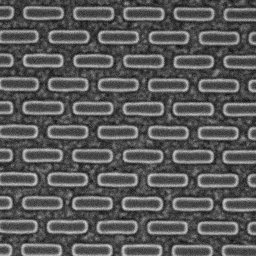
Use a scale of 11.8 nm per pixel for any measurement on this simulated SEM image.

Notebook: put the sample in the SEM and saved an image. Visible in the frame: groups of lines, slits or small figures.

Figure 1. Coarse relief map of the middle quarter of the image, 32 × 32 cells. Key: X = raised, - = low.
---XXXXXXXXX----XXXXXXXXX---XXXX
--------------------------------
--------------------------------
--------------------------------
XXXXXX---XXXXXXXXX---XXXXXXXXXX-
XXXXXX---XXXXXXXXX---XXXXXXXXXX-
XXX-X----XXXXXXXXX----XXXXXXXXX-
--------------------------------
--------------------------------
--------------------------------
--XXXXXXXXXX---XXXXXXXXXX--XXXXX
--XXXXXXXXXX---XXXXXXXXXX--XXXXX
------------------XXXXXX----XXXX
--------------------------------
--------------------------------
--------------------------------
XXXXXX---XXXXXXXXX---XXXXXXXXXX-
XXXXXX---XXXXXXXXX---XXXXXXXXXX-
-----------------------XXX-XXX--
--------------------------------
--------------------------------
---X--XX------------------------
--XXXXXXXXXX---XXXXXXXXX---XXXXX
--XXXXXXXXXX---XXXXXXXXX---XXXXX
------XXXXX------XXXXXXX----XXXX
--------------------------------
--------------------------------
XXXXX----XXXXXX-----------------
XXXXXX---XXXXXXXXX---XXXXXXXXXX-
XXXXXX---XXXXXXXXX---XXXXXXXXXX-
------------XX----------XXXXXX--
--------------------------------